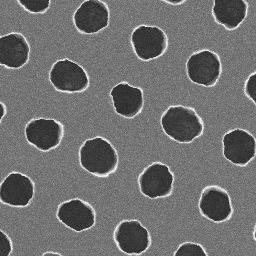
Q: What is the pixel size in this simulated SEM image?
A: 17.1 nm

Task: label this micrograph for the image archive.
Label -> a regular array of holes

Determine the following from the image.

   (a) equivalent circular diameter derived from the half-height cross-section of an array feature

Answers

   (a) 556 nm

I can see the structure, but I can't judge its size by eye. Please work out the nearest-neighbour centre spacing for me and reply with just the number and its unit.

1040 nm